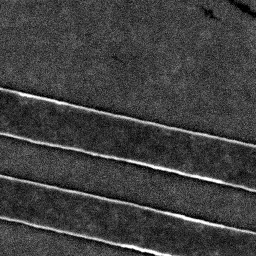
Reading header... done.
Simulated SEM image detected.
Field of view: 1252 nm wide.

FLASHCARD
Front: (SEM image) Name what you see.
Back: one or a few lines or trenches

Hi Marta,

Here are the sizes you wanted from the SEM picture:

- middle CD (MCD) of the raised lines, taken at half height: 213 nanometers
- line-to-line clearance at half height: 199 nanometres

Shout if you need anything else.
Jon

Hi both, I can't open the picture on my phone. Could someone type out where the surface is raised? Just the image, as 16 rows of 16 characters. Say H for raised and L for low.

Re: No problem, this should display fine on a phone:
LLLLLLLLLLLLLLLL
LLLLLLLLLLLLLLLL
LLLLLLLLLLLLLLLL
LLLLLLLLLLLLLLLL
LLLLLLLLLLLLLLLL
LLLLLLLLLLLLLLLL
HHHHLLLLLLLLLLLL
HHHHHHHHHLLLLLLL
LHHHHHHHHHHHHLLL
LLLLLHHHHHHHHHHH
LLLLLLLLLLHHHHHH
HHLLLLLLLLLLLLHH
HHHHHHHLLLLLLLLL
HHHHHHHHHHHLLLLL
LLLLHHHHHHHHHHHH
LLLLLLLLHHHHHHHH